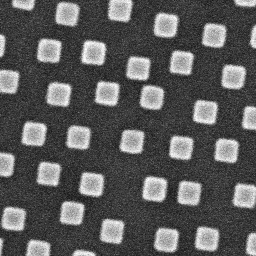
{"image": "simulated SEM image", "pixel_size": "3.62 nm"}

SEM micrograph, a regular array of raised bodies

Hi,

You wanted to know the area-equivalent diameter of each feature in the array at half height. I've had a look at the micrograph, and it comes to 83.4 nm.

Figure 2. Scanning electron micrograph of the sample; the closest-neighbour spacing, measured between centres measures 152 nanometers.